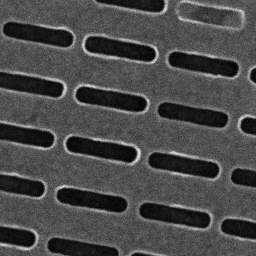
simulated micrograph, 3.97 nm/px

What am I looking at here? a regular array of holes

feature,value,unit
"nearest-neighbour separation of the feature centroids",0.203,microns